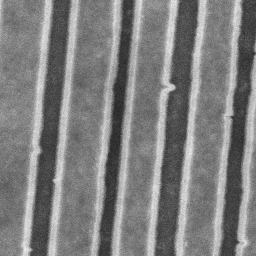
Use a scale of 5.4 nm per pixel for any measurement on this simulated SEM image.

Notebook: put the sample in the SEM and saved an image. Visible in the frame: one or a few lines or trenches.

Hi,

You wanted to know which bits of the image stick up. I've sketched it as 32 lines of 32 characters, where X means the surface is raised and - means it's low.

XXXXXX---XXXXXX--XXXXX---XXXXX--
XXXXXX---XXXXXX--XXXXX---XXXXX--
XXXXXX---XXXXX---XXXX----XXXXX--
XXXXXX---XXXXX---XXXX----XXXX---
XXXXXX---XXXXXX--XXXX----XXXX---
XXXXXX---XXXXX---XXXX----XXXX---
XXXXX----XXXXX---XXXX----XXXX---
XXXXX----XXXXX---XXXX----XXXX---
XXXXX----XXXXX---XXXX----XXXX---
XXXXX----XXXXX---XXXX----XXXX---
XXXXX----XXXXX--XXXXX----XXXX---
XXXXX---XXXXXX--XXXXX---XXXXX---
XXXXX---XXXXXX--XXXX----XXXXX---
XXXXX---XXXXX---XXXX----XXXXX--X
XXXXX---XXXXX---XXXX----XXXX---X
XXXXX---XXXXX---XXXX----XXXX---X
XXXXX---XXXXX---XXXX----XXXX---X
XXXX----XXXXX---XXXX----XXXX---X
XXXXX---XXXXX---XXXX----XXXX---X
XXXX----XXXXX---XXXX----XXXX---X
XXXX----XXXXX---XXXX---XXXXX---X
XXXX---XXXXXX--XXXXX---XXXXX---X
XXXX---XXXXXX--XXXXX---XXXXX---X
XXXX---XXXXX---XXXX----XXXXX---X
XXXX---XXXXX---XXXX----XXXXX---X
XXXX---XXXXX---XXXX----XXXX----X
XXXX---XXXXX---XXXX----XXXX---XX
XXXX---XXXXX---XXXX----XXXX---XX
XXX----XXXXX---XXXX----XXXX---XX
XXX----XXXXX---XXXX----XXXX---XX
XXX----XXXXX--XXXXX---XXXXX---XX
XXX---XXXXXX--XXXXX----XXXX---XX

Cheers